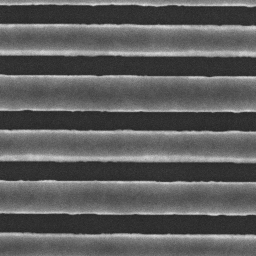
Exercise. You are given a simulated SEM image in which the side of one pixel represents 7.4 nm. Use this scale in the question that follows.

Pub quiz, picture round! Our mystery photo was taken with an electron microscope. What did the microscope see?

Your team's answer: lines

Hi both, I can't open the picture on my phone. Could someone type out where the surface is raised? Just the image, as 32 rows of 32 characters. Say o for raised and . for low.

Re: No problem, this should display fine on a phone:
oooooooooooooooooooooooooooooooo
................................
................................
oooooooooooooooooooooooooooooooo
oooooooooooooooooooooooooooooooo
oooooooooooooooooooooooooooooooo
oooooooooooooooooooooooooooooooo
................................
................................
oooooooooooooooooo..............
oooooooooooooooooooooooooooooooo
oooooooooooooooooooooooooooooooo
oooooooooooooooooooooooooooooooo
oooooooooooooooooooooooooooooooo
................................
................................
ooooooooooooooooooooo...o.o.oo..
oooooooooooooooooooooooooooooooo
oooooooooooooooooooooooooooooooo
oooooooooooooooooooooooooooooooo
................................
................................
................................
oooooooooooooooooooooooooooooooo
oooooooooooooooooooooooooooooooo
oooooooooooooooooooooooooooooooo
oooooooooooooooooooooooooooooooo
................................
................................
oooooooooooooooooooooooooooooooo
oooooooooooooooooooooooooooooooo
oooooooooooooooooooooooooooooooo